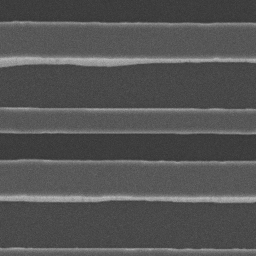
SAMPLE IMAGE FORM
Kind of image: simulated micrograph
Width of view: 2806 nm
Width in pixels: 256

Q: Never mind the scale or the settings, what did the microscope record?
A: lines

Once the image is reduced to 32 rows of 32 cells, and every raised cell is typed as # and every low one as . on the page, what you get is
................................
................................
................................
################################
################################
################################
################################
##########################.....#
................................
................................
................................
................................
................................
................................
################################
################################
.######.########################
................................
................................
................................
################################
################################
################################
################################
################################
................................
................................
................................
................................
................................
................................
################################